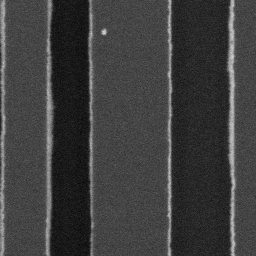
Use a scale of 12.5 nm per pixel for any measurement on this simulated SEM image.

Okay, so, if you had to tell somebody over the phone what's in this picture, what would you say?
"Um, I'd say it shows lines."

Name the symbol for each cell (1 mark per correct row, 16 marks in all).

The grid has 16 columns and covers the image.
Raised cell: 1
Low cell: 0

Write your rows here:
1110001111100001
1110001111100011
1110001111100001
1110001111100001
1110001111100001
1110001111100001
1110001111100001
1110001111100001
1110001111100001
1110001111100001
1110001111100001
1110001111100001
1110001111100001
1110001111100001
1110001111100001
1110001111100001